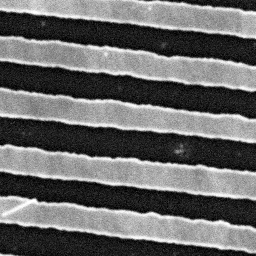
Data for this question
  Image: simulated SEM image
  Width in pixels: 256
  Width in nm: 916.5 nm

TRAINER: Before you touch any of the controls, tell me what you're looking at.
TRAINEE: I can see lines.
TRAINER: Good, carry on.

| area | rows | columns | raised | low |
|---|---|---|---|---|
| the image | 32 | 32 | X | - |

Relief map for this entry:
XXXXXXXXXXXXXXXXXXXXXXXX--------
--XXXXXXXXXXXXXXXXXXXXXXXXXXXXXX
------------XXXXXXXXXXXXXXXXXXXX
--------------------XXXXXXXXXXXX
------------------------------XX
XXXXXXXXXX----------------------
XXXXXXXXXXXXXXXXXX--------------
XXXXXXXXXXXXXXXXXXXXXXXXXXX-----
--------XXXXXXXXXXXXXXXXXXXXXXXX
-----------------XXXXXXXXXXXXXXX
-------------------------XXXXXXX
XXX-----------------------------
XXXXXXXXXXX---------------------
XXXXXXXXXXXXXXXXXXXXX-----------
XXXXXXXXXXXXXXXXXXXXXXXXXXXXXX--
----------XXXXXXXXXXXXXXXXXXXXXX
----------------------XXXXXXXXXX
-----------------------------XXX
XXXX----------------------------
XXXXXXXXXXX---------------------
XXXXXXXXXXXXXXXXXXXXX-----------
-XXXXXXXXXXXXXXXXXXXXXXXXXXXXXX-
---------XXXXXXXXXXXXXXXXXXXXXXX
------------------XXXXXXXXXXXXXX
----------------------------XXXX
XXXXXXXXX-----------------------
XXXXXXXXXXXXXXXXX---------------
XXXXXXXXXXXXXXXXXXXXXXXX--------
-------XXXXXXXXXXXXXXXXXXXXXXXXX
---------------XXXXXXXXXXXXXXXXX
-----------------------XXXXXXXXX
-------------------------------X